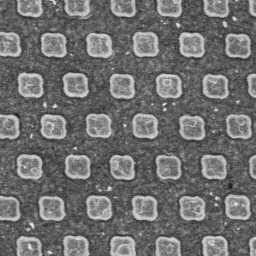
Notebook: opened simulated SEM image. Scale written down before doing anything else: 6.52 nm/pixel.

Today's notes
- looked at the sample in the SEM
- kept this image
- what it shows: a regular array of raised bodies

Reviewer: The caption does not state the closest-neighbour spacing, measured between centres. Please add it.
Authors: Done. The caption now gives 298 nanometres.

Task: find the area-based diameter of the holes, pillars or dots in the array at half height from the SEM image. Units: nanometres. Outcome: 163